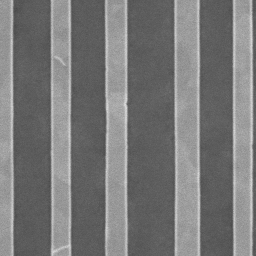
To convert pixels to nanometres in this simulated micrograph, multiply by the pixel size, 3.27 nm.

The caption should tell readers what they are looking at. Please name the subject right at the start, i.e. one or a few lines or trenches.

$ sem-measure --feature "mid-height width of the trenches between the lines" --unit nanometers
125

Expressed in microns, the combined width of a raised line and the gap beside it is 0.199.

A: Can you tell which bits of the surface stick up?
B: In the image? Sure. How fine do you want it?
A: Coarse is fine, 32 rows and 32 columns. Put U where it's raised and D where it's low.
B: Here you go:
UDDDDDUUUDDDDUUUDDDDDDUUUDDDDUUD
UDDDDDUUUDDDDUUUDDDDDDUUUDDDDUUD
UDDDDDUUUDDDDUUUDDDDDDUUUDDDDUUD
UDDDDDUUUDDDDUUUDDDDDDUUUDDDDUUD
UDDDDDUUUDDDDUUUDDDDDDUUUDDDDUUD
UDDDDDUUUDDDDUUUDDDDDDUUUDDDDUUD
UDDDDDUUUDDDDUUUDDDDDDUUUDDDDUUD
UDDDDDUUUDDDDUUUDDDDDDUUUDDDDUUD
UDDDDDUUUDDDDUUUDDDDDDUUUDDDDUUD
UDDDDDUUUDDDDUUUDDDDDDUUUDDDDUUD
UDDDDDUUUDDDDUUUDDDDDDUUUDDDDUUD
UDDDDDUUUDDDDUUUDDDDDDUUUDDDDUUD
UDDDDDUUUDDDDUUUDDDDDDUUUDDDDUUD
UDDDDDUUUDDDDUUUDDDDDDUUUDDDDUUD
UDDDDDUUUDDDDUUUDDDDDDUUUDDDDUUD
UDDDDDUUUDDDDUUUDDDDDDUUUDDDDUUD
UDDDDDUUUDDDDUUUDDDDDDUUUDDDDUUD
UDDDDDUUUDDDDUUUDDDDDDUUUDDDDUUD
UDDDDDUUUDDDDUUUDDDDDDUUUDDDDUUD
UDDDDDUUUDDDDUUUDDDDDDUUUDDDDUUD
UDDDDDDUUDDDDUUUDDDDDDUUUDDDDUUD
UDDDDDDUUDDDDUUUDDDDDDUUUDDDDUUD
UUDDDDDUUDDDDUUUDDDDDDUUUDDDDUUD
UUDDDDDUUDDDDUUUDDDDDDUUUDDDDUUD
UUDDDDDUUDDDDUUUDDDDDDUUUDDDDUUD
UUDDDDDUUDDDDUUUDDDDDDUUUDDDDUUD
UDDDDDDUUDDDDUUUDDDDDDUUUDDDDUUD
UDDDDDDUUDDDDUUUDDDDDDUUUDDDDUUD
UDDDDDDUUDDDDUUUDDDDDDUUUDDDDUUD
UDDDDDUUUDDDDUUUDDDDDDUUUDDDDUUD
UDDDDDDUUDDDDUUUDDDDDDUUUDDDDUUD
UDDDDDDUUDDDDUUUDDDDDDUUUDDDDUUD